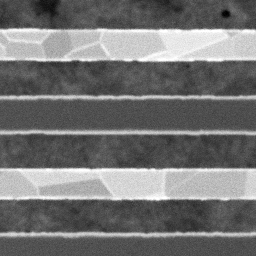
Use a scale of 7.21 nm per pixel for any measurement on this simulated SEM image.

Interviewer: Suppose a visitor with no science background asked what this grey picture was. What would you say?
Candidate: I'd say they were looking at lines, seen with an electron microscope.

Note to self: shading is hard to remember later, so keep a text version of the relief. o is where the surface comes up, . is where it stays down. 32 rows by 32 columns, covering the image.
................................
................................
................................
................................
oooooooooooooooooooooooooooooooo
oooooooooooooooooooooooooooooooo
oooooooooooooooooooooooooooooooo
....ooooo.oo...ooooooooooooo....
................................
................................
................................
................................
oooooooooooooooooooooooooooooooo
oooooooooooooooooooooooooooooooo
oooooooooooooooooooooooooooooooo
oooooooooooooooooooooooooooooooo
oooo.ooooooooooooooooooooooooooo
................................
................................
................................
................................
oooooooooooooooooooooooooooooooo
oooooooooooooooooooooooooooooooo
oooooooooooooooooooooooooooooooo
oooooooooooooooooooooooooooooooo
................................
................................
................................
................................
oooooooooooooooooooooooooooooooo
oooooooooooooooooooooooooooooooo
oooooooooooooooooooooooooooooooo